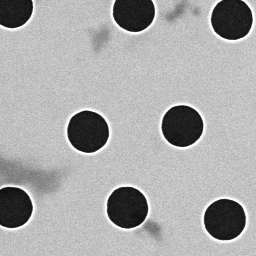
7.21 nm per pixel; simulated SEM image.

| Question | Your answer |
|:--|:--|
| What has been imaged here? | holes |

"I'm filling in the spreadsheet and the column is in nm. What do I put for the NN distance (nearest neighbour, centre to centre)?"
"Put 649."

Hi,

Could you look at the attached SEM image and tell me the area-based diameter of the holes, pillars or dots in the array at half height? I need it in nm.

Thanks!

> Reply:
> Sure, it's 303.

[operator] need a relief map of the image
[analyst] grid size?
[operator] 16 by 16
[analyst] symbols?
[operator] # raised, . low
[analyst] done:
..#####...###...
.######..####...
################
################
################
################
################
####...###...###
####...###...###
#####.##########
################
################
..#####..#######
..#####..####..#
#############..#
################